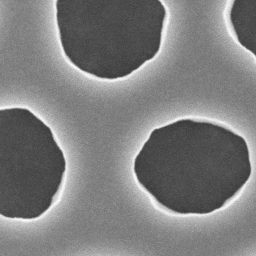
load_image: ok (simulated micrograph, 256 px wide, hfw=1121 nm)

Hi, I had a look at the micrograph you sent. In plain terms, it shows holes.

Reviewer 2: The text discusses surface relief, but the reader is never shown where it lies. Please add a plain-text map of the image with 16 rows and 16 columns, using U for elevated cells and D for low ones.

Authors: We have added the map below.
UUUDDDDDDDUUUUDD
UUUUDDDDDDUUUUDD
UUUUDDDDDDUUUUUD
UUUUDDDDDDUUUUUU
UUUUUDDDUUUUUUUU
UUUUUUUUUUUUUUUU
UUUUUUUUUUUUUUUU
DDUUUUUUUUUUUUUU
DDDUUUUUUDDDDDDU
DDDDUUUUUDDDDDDD
DDDDUUUUDDDDDDDD
DDDDUUUUUDDDDDDU
DDDUUUUUUUDDDDUU
DDUUUUUUUUUUUUUU
UUUUUUUUUUUUUUUU
UUUUUUUUUUUUUUUU